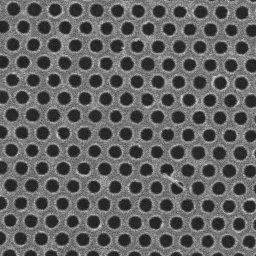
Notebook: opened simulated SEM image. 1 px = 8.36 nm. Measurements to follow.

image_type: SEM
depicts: a regular array of holes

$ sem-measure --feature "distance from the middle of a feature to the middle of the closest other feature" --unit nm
169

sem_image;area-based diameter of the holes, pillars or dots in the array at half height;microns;0.111